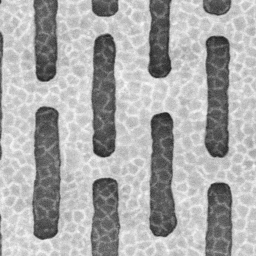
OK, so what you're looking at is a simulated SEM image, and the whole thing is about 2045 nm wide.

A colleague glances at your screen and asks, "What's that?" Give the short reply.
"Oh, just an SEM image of holes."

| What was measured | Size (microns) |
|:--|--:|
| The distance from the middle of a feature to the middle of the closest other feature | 0.772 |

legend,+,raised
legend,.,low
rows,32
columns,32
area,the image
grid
++++...++++....++++..++++....+++
++++...+++++...++++..+++++..++++
++++...++++++++++++..+++++++++++
++++...++++++++++++..+++++++++++
++++...+++++..+++++..+++++..++++
++++...+++++..+++++..+++++...+++
++++...+++++...++++..+++++...+++
++++...+++++..+++++..+++++...+++
++++...+++++..++++...+++++...+++
++++...+++++..+++++..+++++...+++
+++++++++++....+++++++++++...+++
+++++++++++....+++++++++++...+++
+++++++++++....+++++++++++...+++
+++++..++++....+++++++++++...+++
++++...+++++..+++++..+++++...+++
++++...++++...+++++...++++...+++
++++...+++++...++++...++++...+++
++++....+++...+++++...+++....+++
++++....++++..+++++...++++...+++
++++....++++..+++++...++++..++++
++++....+++++++++++...++++++++++
++++....+++++++++++...++++++++++
++++....++++..+++++...++++++++++
++++....+++....++++...++++...+++
++++....+++....++++...++++...+++
++++...+++++...++++...++++...+++
++++....++++...++++...++++...+++
++++...++++....++++...++++...+++
++++...++++....++++...++++...+++
++++...++++....++++..+++++...+++
+++++++++++....+++++++++++...+++
+++++++++++....+++++++++++...+++